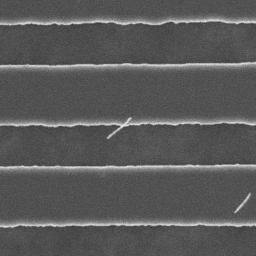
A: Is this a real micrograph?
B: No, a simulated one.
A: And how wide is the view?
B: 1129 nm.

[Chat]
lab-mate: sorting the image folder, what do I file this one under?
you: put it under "lines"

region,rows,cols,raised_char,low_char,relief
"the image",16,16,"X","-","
XXXXXXXXXXXXXXXX
XXXXX----X------
----------------
----------------
XXXXXXXXXXXXXXXX
XXXXXXXXXXXXXXXX
XXXXXXXXXXXXXXXX
XXXXXXXXXXXXXXXX
----------------
----------------
XXXXXXXXXXXXXXXX
XXXXXXXXXXXXXXXX
XXXXXXXXXXXXXXXX
XXXXXXXXXXXXXXXX
----------------
----------------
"